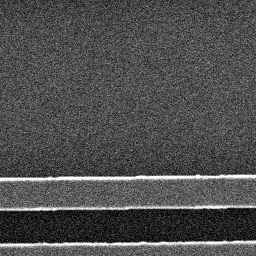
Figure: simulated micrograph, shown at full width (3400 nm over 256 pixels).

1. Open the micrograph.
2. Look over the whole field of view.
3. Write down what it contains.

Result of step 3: lines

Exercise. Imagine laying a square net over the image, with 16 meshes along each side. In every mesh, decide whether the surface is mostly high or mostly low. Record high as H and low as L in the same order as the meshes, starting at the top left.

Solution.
LLLLLLLLLLLLLLLL
LLLLLLLLLLLLLLLL
LLLLLLLLLLLLLLLL
LLLLLLLLLLLLLLLL
LLLLLLLLLLLLLLLL
LLLLLLLLLLLLLLLL
LLLLLLLLLLLLLLLL
LLLLLLLLLLLLLLLL
LLLLLLLLLLLLLLLL
LLLLLLLLLLLLLLLL
LLLLLLLLLLLLLLLL
HHHHHHHHHHHHHHHH
HHHHHHHHHHHHHHHH
LLLLLLLLLLLLLLLL
LLLLLLLLLLLLLLLL
HHHHHHHHHHHHHHHH